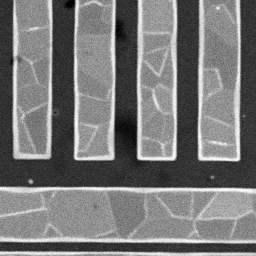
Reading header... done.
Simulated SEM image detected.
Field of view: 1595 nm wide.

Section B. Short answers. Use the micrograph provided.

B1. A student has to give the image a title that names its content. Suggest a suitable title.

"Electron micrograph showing wiring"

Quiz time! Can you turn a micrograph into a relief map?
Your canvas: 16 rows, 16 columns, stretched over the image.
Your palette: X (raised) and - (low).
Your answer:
-XX--XX--XX--XX-
-XX--XX--XX--XX-
-XX--XX--XX--XX-
-XX--XX--XX--XX-
-XX--XX--XX--XX-
-XX--XX--XX--XX-
-XX--XX--XX--XX-
-XX--XX--XX-XXX-
-XX--XX--XX-XXX-
-XX--XX--XX--XX-
----------------
----------------
XXXXXXXXXXXXXXXX
XXXXXXXXXXXXXXXX
XXXXXXXXXXXXXXXX
----------------